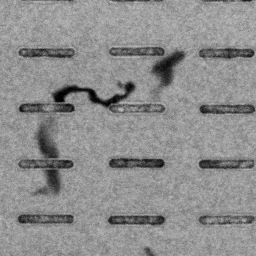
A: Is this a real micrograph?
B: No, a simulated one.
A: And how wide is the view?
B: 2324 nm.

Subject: a regular array of holes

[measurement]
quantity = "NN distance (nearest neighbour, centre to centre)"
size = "501 nm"